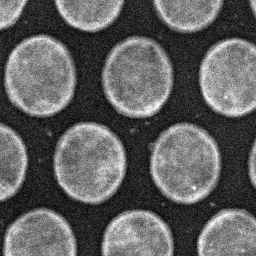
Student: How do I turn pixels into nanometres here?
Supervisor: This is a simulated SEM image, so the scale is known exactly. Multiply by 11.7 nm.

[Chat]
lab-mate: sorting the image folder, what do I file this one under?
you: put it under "raised bodies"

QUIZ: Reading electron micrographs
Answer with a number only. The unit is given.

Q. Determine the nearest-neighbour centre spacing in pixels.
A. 96.7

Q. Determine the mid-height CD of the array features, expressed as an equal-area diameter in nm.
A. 859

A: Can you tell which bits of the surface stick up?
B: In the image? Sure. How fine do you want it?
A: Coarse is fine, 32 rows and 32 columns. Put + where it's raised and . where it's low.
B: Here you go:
+++....++++++++....+++++++++...+
+++.....+++++++.....+++++++.....
++......++++++.......+++++......
..........+++.........+++.......
................................
...++++........++++........++++.
..++++++......++++++......++++++
.++++++++....++++++++.....++++++
.++++++++....++++++++....+++++++
.++++++++....++++++++....+++++++
.++++++++....++++++++....+++++++
.++++++++....++++++++....+++++++
..+++++++.....+++++++.....++++++
...+++++.......+++++.......+++++
................................
..........+.....................
++.......+++++.......++++.......
+++.....+++++++.....++++++......
+++....++++++++....++++++++.....
+++....++++++++....++++++++....+
+++....+++++++++...++++++++....+
+++....+++++++++...++++++++....+
+++....++++++++....++++++++.....
++......+++++++.....++++++......
+........++++........++++.......
................................
....+++..........+..........++..
..++++++......++++++.......+++++
.++++++++.....+++++++.....++++++
.++++++++....++++++++....+++++++
.++++++++....++++++++....+++++++
.++++++++....++++++++....+++++++